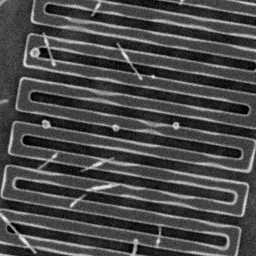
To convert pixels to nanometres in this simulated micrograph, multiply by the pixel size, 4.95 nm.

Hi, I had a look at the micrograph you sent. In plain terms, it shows groups of lines, slits or small figures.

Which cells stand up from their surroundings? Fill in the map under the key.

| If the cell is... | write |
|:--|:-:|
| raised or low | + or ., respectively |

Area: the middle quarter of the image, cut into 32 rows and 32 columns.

++++++.................+++++++++
++++++++++++...............+++++
..+++++++++++++++++.............
........+++++++++++++++.........
.............++++++++++++++++...
++................++++++++++++++
+++++++.................++++++++
+++++++++++++.................++
...+++++++++++++++++............
..........+++++++++++++++.......
..............+++++++++++++++++.
+++++.................++++++++++
++++++++++................++++++
++++++++++++++++................
.....+++++++++++++++............
...........++++++++++++++++++...
+................+++++++++++++++
++++++..................++++++++
++++++++++++................++++
..+++++++++++++++...............
.......+++++++++++++++..........
...............+++++++++++++++..
+++.................++++++++++++
++++++++................++++++++
+++++++++++++..................+
....+++++++++++++++++...........
.........+++++++++++++++++......
................+++++++++++++++.
+++++................+++++++++++
+++++++++++.................++++
++++++++++++++++................
.....+++++++++++++++++..........